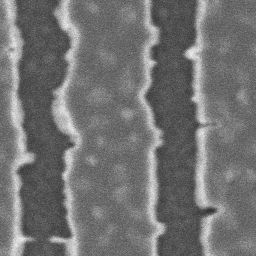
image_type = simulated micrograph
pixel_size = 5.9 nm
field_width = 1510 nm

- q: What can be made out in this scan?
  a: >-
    one or a few lines or trenches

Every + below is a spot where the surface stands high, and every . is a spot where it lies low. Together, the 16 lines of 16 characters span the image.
+...+++++....+++
+...+++++...++++
+....+++++..++++
+...+++++...++++
+...+++++...++++
+...+++++...++++
+...+++++...++++
+...+++++....+++
+...++++++..++++
++..++++++...+++
+...++++++..++++
+...++++++..++++
+...++++++...+++
+...++++++...+++
+...++++++...+++
+...++++++...+++